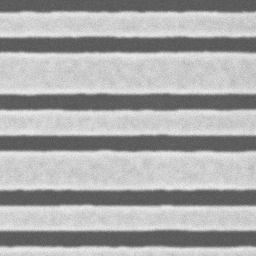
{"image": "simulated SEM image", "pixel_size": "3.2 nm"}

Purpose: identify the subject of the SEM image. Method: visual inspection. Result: lines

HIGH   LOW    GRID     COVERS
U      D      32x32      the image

DDDDDDDDDDDDDDDDDDDDDDDDDDDDDDDD
DDDDDDDDDDDDDDDDDDDDDDDDDDDDDDDD
UUUUUUUUUUUUUUUUUUUUUUUUUUUUUUUU
UUUUUUUUUUUUUUUUUUUUUUUUUUUUUUUU
UUUUUUUUUUUDDDUUUUUUUUDUUUUUUUUU
DDDDDDDDDDDDDDDDDDDDDDDDDDDDDDDD
DDDDDDDDDDDDDDDDDDDDDDDDDDDDDDDD
UUUUUUUUUUUUUUUUUUUUUUUUUUUUUUUU
UUUUUUUUUUUUUUUUUUUUUUUUUUUUUUUU
UUUUUUUUUUUUUUUUUUUUUUUUUUUUUUUU
UUUUUUUUUUUUUUUUUUUUUUUUUUUUUUUU
UUUUUUUUUUUUUUUUUUUUUUUUUUUUUUUU
DDDDDDDDDDDDDDDDDDDDDDDDDDDDDDDD
DDDDDDDDDDDDDDDDDDDDDDDDDDDDDDDD
UUUUUUUUUUUUUUUUUUUUUUUUUUUUUUUU
UUUUUUUUUUUUUUUUUUUUUUUUUUUUUUUU
UUUUUUUUUUUUUUUUUUUUUUUUUUUUUUUU
DDDDDDDDDDDDDDDDDDDDDDDDDDDDDDDD
DDDDDDDDDDDDDDDDDDDDDDDDDDDDDDDD
UUUUUUUUUUUUUUUUUUUUUUUUUUUUUUUU
UUUUUUUUUUUUUUUUUUUUUUUUUUUUUUUU
UUUUUUUUUUUUUUUUUUUUUUUUUUUUUUUU
UUUUUUUUUUUUUUUUUUUUUUUUUUUUUUUU
UUUUUUUUUUUUUUUUUUUUUUUUUUUUUUUU
DDDDDDDDDDDDDDDDDDDDDDDDDDDDDDDD
DDDDDDDDDDDDDDDDDDDDDDDDDDDDDDDD
UUUUUUUUUUUUUUUUUUUUUUUUUUUUUUUU
UUUUUUUUUUUUUUUUUUUUUUUUUUUUUUUU
UUUUUUUUUUUUUUUUUUUUUUUUUUUUUUUU
DDDDDDDDDDDDDDDDDDDDDDDDDDDDDDDD
DDDDDDDDDDDDDDDDDDDDDDDDDDDDDDDD
UUUUUUUUUUUUUUUUUUUUUUUUUUUUUUUU